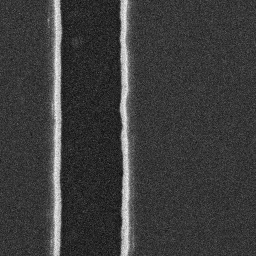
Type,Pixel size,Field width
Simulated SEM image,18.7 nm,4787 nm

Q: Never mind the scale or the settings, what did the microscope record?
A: one or a few lines or trenches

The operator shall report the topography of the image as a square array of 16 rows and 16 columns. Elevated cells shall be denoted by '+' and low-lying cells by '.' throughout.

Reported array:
++++....++++++++
++++....++++++++
++++....++++++++
++++....++++++++
++++....++++++++
++++....++++++++
++++....++++++++
++++....++++++++
++++....++++++++
++++....++++++++
++++....++++++++
++++....++++++++
++++....++++++++
++++....++++++++
++++....++++++++
++++....++++++++